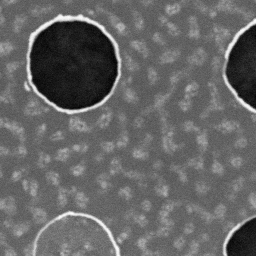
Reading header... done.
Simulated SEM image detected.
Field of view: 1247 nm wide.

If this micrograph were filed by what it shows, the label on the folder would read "holes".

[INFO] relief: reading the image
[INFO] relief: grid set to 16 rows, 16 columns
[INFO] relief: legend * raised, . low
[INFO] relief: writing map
****************
***...**********
**.....********.
**.....*******..
**.....*******..
**.....********.
***...*********.
****************
****************
****************
****************
****************
****************
****************
***************.
**************..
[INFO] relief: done